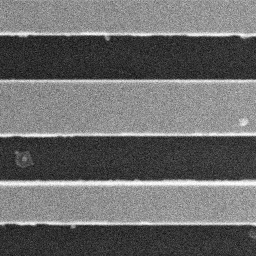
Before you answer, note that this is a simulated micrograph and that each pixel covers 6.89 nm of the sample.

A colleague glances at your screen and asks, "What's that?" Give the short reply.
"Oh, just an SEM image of lines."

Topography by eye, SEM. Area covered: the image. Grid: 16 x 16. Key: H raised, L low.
HHHHHHHHHHHHHHHH
HHHHHHHHHHHHHHHH
LLLLLLLLLLLLLLLL
LLLLLLLLLLLLLLLL
LLLLLLLLLLLLLLLL
HHHHHHHHHHHHHHHH
HHHHHHHHHHHHHHHH
HHHHHHHHHHHHHHHH
HHHHHLLLLLLLLLLL
LLLLLLLLLLLLLLLL
LLLLLLLLLLLLLLLL
HHHHHHHHHHHHHHHH
HHHHHHHHHHHHHHHH
HHHHHHHHHHHHHHHH
LLLLLLLLLLLLLLLL
LLLLLLLLLLLLLLLL